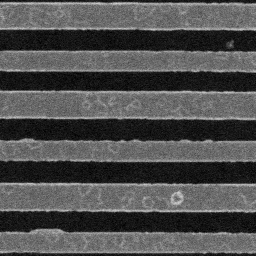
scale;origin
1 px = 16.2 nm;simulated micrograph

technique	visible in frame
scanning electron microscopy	lines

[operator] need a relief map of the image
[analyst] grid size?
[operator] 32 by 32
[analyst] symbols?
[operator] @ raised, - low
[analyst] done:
@@@@@@@@@@@@@@@@@@@@@@@@@@-@@@--
@@@@@@@@@@@@@@@@@@@@@@@@@@@@@@@@
@@@@@@@@@@@@@@@@@@@@@@@@@@@@@@@@
@@@@@@@@@@@@@@@@@@@@@@@@@@@@@@@@
--------------------------------
--------------------------------
@@@@@@@@@@@@@@@@@@@@@@@@@@@@-@@-
@@@@@@@@@@@@@@@@@@@@@@@@@@@@@@@@
@@@@@@@@@@@@@@@@@@@@@@@@@@@@@@@@
--------------------------------
--------------------------------
@@@@@@@@@@@@@@@@@@@@@@@@@-@-----
@@@@@@@@@@@@@@@@@@@@@@@@@@@@@@@@
@@@@@@@@@@@@@@@@@@@@@@@@@@@@@@@@
@@@@@@@@@@@@@@@@@@@@@@@@@@@@@@@@
--------------------------------
--------------------------------
---@----------------------------
@@@@@@@@@@@@@@@@@@@@@@@@@@@@@@@@
@@@@@@@@@@@@@@@@@@@@@@@@@@@@@@@@
--------------------------------
--------------------------------
--------------------------------
@@@@@@@@@@@@@@@@@@@@@@@@@@@@@@@@
@@@@@@@@@@@@@@@@@@@@@@@@@@@@@@@@
@@@@@@@@@@@@@@@@@@@@@@@@@@@@@@@@
--------------------------------
--------------------------------
--------------------------------
@@@@@@@@@@@@@@@@@@@@@@@@@@@@@@@@
@@@@@@@@@@@@@@@@@@@@@@@@@@@@@@@@
-------------------------@@@-@@@